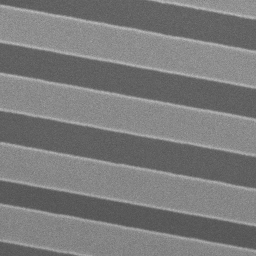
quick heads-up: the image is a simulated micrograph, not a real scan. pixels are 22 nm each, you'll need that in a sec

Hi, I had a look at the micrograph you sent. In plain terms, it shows lines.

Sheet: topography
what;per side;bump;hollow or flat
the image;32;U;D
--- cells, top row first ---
DDDDDDDDDDDDDDDDDDDDDDUUUUUUUUUU
UUUUUDDDDDDDDDDDDDDDDDDDDDDUUUUU
UUUUUUUUUUDDDDDDDDDDDDDDDDDDDDDD
UUUUUUUUUUUUUUUUDDDDDDDDDDDDDDDD
UUUUUUUUUUUUUUUUUUUUUDDDDDDDDDDD
DUUUUUUUUUUUUUUUUUUUUUUUUUUDDDDD
DDDDDDDUUUUUUUUUUUUUUUUUUUUUUUUU
DDDDDDDDDDDDDUUUUUUUUUUUUUUUUUUU
DDDDDDDDDDDDDDDDDDUUUUUUUUUUUUUU
UUDDDDDDDDDDDDDDDDDDDDDDUUUUUUUU
UUUUUUUUDDDDDDDDDDDDDDDDDDDDDUUU
UUUUUUUUUUUUUDDDDDDDDDDDDDDDDDDD
UUUUUUUUUUUUUUUUUUUDDDDDDDDDDDDD
UUUUUUUUUUUUUUUUUUUUUUUUDDDDDDDD
DDDDUUUUUUUUUUUUUUUUUUUUUUUUUUDD
DDDDDDDDDUUUUUUUUUUUUUUUUUUUUUUU
DDDDDDDDDDDDDDDUUUUUUUUUUUUUUUUU
DDDDDDDDDDDDDDDDDDDDDUUUUUUUUUUU
UUUUDDDDDDDDDDDDDDDDDDDDDDDUUUUU
UUUUUUUUUDDDDDDDDDDDDDDDDDDDDDDD
UUUUUUUUUUUUUUUDDDDDDDDDDDDDDDDD
UUUUUUUUUUUUUUUUUUUUDDDDDDDDDDDD
UUUUUUUUUUUUUUUUUUUUUUUUUUDDDDDD
DDDDDDUUUUUUUUUUUUUUUUUUUUUUUUUD
DDDDDDDDDDDUUUUUUUUUUUUUUUUUUUUU
DDDDDDDDDDDDDDDDDUUUUUUUUUUUUUUU
UUUUUDDDDDDDDDDDDDDDDDUUUUUUUUUU
UUUUUUUUUUUDDDDDDDDDDDDDDDDDUUUU
UUUUUUUUUUUUUUUUUDDDDDDDDDDDDDDD
UUUUUUUUUUUUUUUUUUUUUUDDDDDDDDDD
DDUUUUUUUUUUUUUUUUUUUUUUUUUUDDDD
DDDDDDDDUUUUUUUUUUUUUUUUUUUUUUUU